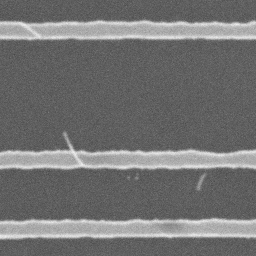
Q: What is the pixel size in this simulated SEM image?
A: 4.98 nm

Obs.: lines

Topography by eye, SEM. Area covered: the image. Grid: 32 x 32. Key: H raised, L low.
LLLLLLLLLLLLLLLLLLLLLLLLLLLLLLLL
LLLLLLLLLLLLLLLLLLLLLLLLLLLLLLLL
LLLLLLLLLLLLLLLLLLLLLLLLLLLLLLLL
HHHHHHHHHHHHHHHHHHHHHHHHHHHHHHHH
HHHHHHHHHHHHHHHHHHHHHHHHHHHHHHHH
LLLLLLLLLLLLLLLLLLLLLLLLLLLLLLLL
LLLLLLLLLLLLLLLLLLLLLLLLLLLLLLLL
LLLLLLLLLLLLLLLLLLLLLLLLLLLLLLLL
LLLLLLLLLLLLLLLLLLLLLLLLLLLLLLLL
LLLLLLLLLLLLLLLLLLLLLLLLLLLLLLLL
LLLLLLLLLLLLLLLLLLLLLLLLLLLLLLLL
LLLLLLLLLLLLLLLLLLLLLLLLLLLLLLLL
LLLLLLLLLLLLLLLLLLLLLLLLLLLLLLLL
LLLLLLLLLLLLLLLLLLLLLLLLLLLLLLLL
LLLLLLLLLLLLLLLLLLLLLLLLLLLLLLLL
LLLLLLLLLLLLLLLLLLLLLLLLLLLLLLLL
LLLLLLLLLLLLLLLLLLLLLLLLLLLLLLLL
LLLLLLLLLLLLLLLLLLLLLLLLLLLLLLLL
LLLLLLLLLLLLLLLLLLLLLLLLLLLLLLLL
HHHHHHHHHHHHHHHHHHHHHHHHHHHHHHHH
HHHHHHHHHHHHHHHHHHHHHHHHHHHHHHHH
LLLLLLLLLLLLLLLLLLLLLLLLLLLLLLLL
LLLLLLLLLLLLLLLLLLLLLLLLLLLLLLLL
LLLLLLLLLLLLLLLLLLLLLLLLLLLLLLLL
LLLLLLLLLLLLLLLLLLLLLLLLLLLLLLLL
LLLLLLLLLLLLLLLLLLLLLLLLLLLLLLLL
LLLLLLLLLLLLLLLLLLLLLLLLLLLLLLLL
LLLLLLLLLLLLLLLLLLLLLLLLLLHHLLLL
HHHHHHHHHHHHHHHHHHHHHHHHHHHHHHHH
HHHHHHHHHHHHHHHHHHHHHHHHHHHHHHHH
LLLLLLLLLLLLLLLLLLLLLLLLLLLLLLLL
LLLLLLLLLLLLLLLLLLLLLLLLLLLLLLLL